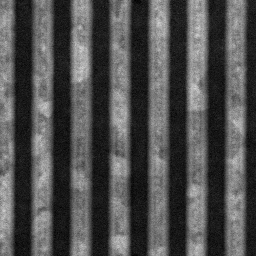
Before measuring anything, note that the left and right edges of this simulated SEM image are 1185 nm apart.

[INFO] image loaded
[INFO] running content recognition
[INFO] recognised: parallel lines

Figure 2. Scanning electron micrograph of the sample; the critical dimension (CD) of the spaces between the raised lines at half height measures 0.099 micrometres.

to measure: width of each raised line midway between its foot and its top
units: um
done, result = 0.0793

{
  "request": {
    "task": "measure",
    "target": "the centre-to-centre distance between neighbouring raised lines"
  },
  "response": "38.7 pixels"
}